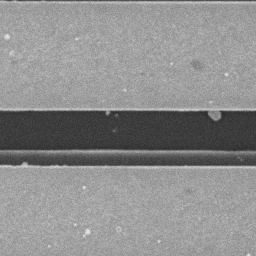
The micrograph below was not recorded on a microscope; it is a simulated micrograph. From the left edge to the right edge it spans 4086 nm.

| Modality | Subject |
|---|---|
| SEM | lines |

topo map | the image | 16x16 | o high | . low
oooooooooooooooo
oooooooooooooooo
oooooooooooooooo
oooooooooooooooo
oooooooooooooooo
oooooooooooooooo
oooooooooooooooo
................
................
................
oooooooooooooooo
oooooooooooooooo
oooooooooooooooo
oooooooooooooooo
oooooooooooooooo
oooooooooooooooo